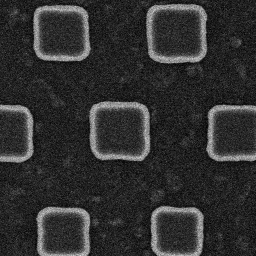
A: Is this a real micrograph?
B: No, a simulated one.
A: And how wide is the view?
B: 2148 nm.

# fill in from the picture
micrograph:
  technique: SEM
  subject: raised bodies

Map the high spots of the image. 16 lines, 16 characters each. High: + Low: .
...++.....++....
..+++....++++...
..++++...++++...
...++.....+++...
................
................
................
++....+++....+++
++....+++....+++
++....+++....+++
................
................
................
...++.....++....
..+++.....+++...
..+++.....+++...